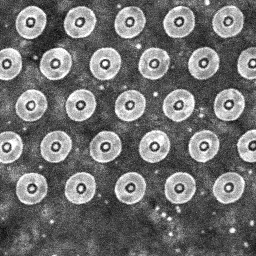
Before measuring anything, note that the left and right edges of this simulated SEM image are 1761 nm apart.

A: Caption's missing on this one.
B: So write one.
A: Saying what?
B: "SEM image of a regular array of ring-shaped raised bodies with a dot in the middle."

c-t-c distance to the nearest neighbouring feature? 330 nm